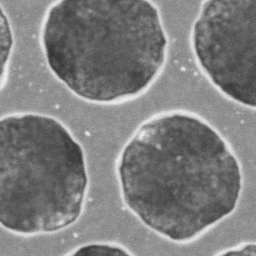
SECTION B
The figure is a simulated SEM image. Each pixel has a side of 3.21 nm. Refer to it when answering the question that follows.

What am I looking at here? holes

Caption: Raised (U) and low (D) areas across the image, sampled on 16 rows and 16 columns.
UUUDDDDDDDUUUDDD
DUUDDDDDDDUUDDDD
DUUDDDDDDDUUDDDD
DUUDDDDDDDUUDDDD
UUUDDDDDDDUUUDDD
UUUUDDDDDUUUUUDD
UUUUUUUUUUUUUUUD
DDDUUUUUUUDDUUUU
DDDDUUUUDDDDDDUU
DDDDDUUUDDDDDDUU
DDDDDUUDDDDDDDDU
DDDDDUUUDDDDDDDU
DDDDDUUUDDDDDDDU
DDDDDUUUUDDDDDUU
UDUUUUUUUUDDDUUU
UUUUUDDDUUUUUUUD